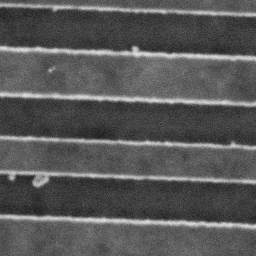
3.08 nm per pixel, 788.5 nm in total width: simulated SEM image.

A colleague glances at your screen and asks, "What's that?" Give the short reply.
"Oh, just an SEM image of lines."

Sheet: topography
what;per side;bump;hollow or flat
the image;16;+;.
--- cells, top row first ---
.....+++++++++++
................
................
++++++++++++++..
++++++++++++++++
++++++++++++++++
..............++
................
................
++++++++++++++++
++++++++++++++++
................
................
+...............
++++++++++++++++
++++++++++++++++